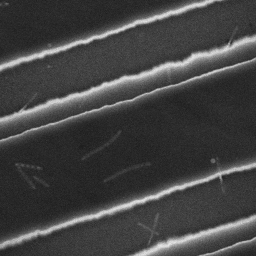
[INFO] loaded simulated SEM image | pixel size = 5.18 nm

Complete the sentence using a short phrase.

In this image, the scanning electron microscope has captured lines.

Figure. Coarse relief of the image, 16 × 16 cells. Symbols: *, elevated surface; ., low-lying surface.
************....
********........
*****...........
**..............
.............***
..........******
.......*********
....************
.***************
****************
***************.
************....
*********.......
******..........
**..............
..............**